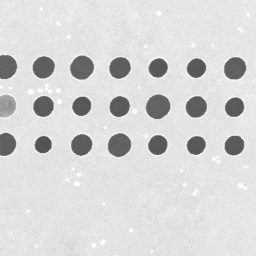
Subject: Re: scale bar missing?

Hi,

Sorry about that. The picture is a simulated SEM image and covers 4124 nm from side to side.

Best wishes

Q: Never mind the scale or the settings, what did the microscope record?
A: a regular array of holes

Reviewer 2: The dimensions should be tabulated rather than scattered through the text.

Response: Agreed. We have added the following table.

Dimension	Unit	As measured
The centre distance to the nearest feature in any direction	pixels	38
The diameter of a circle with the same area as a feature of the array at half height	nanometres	335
